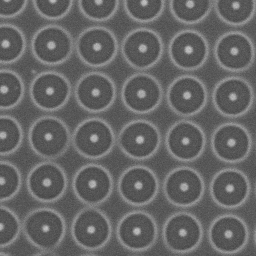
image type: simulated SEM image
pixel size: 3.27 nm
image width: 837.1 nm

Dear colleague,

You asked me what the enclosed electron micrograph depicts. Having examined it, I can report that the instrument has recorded an array of small figures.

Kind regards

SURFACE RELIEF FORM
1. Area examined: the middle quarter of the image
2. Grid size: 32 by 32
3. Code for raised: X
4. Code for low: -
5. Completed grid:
XXXXXXXXXXXXXXXXXX---XXXXXXXX---
XXXXXXXXXXXXXXXXXXXXXXXXXXXXXXXX
XXXXXXXXXXXXXXXXXXXXXXXXXXXXXXXX
XXXXX-----XXXXXXX-----XXXXXXXX--
XXXX-------XXXXX-------XXXXX----
-XXX--------XXX--------XXXX-----
-XX---------XXX---------XXX-----
-XX----XX---XXX----X----XX----X-
XXXX--------XXX---------XX----X-
XXXX--------XXX--------XXXX-----
XXXXX------XXXXX-------XXXX-----
XXXXXXX--XXXXXXXXX---XXXXXXX----
XXXXXXXXXXXXXXXXXXXXXXXXXXXXXX-X
XXXXXXXXXXXXXXXXXXXXXXXXXXXXXXXX
XXXXXX---XXXXXXXXX--XXXXXXXXXXXX
XXXX-------XXXXX------XXXXXX----
XXX--------XXXX--------XXXX-----
-XX---------XXX--------XXX------
-XX----X----XX----------XX------
-XX---------XX---------XXX----X-
XXX---------XX---------XXX------
XXXX-------XXXX--------XXXX-----
XXXXX-----XXXXXX------XXXXX-----
XXXXXXXXXXXXXXXXXXXXXXXXXXXXX---
XXXXXXXXXXXXXXXXXXXXXXXXXXXXXXXX
XXXXXXX-XXXXXXXXXXXXXXXXXXXXXXXX
XXXXX-----XXXXXXX----XXXXXXXX---
XXXX-------XXXX-------XXXXX-----
XXX--------XXXX--------XXX------
XXX----X----XX---------XXX------
XXX----X----XX----X----XX----XX-
XXX--------XXX---------XX-------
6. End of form